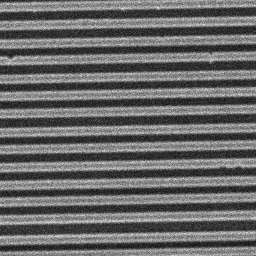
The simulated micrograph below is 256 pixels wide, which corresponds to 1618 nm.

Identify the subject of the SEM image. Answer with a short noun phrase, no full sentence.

parallel lines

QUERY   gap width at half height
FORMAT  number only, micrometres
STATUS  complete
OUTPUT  0.0616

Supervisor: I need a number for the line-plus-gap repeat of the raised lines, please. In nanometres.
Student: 113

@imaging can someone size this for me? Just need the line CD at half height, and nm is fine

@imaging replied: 49